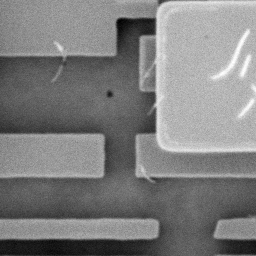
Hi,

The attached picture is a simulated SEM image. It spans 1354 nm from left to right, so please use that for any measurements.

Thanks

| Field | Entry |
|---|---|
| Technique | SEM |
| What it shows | wiring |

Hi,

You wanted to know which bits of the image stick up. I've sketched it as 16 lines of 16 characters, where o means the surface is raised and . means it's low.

..........oooooo
..........oooooo
..........oooooo
..........oooooo
..........oooooo
..........oooooo
..........oooooo
..........oooooo
..........oooooo
................
................
................
................
................
................
................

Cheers